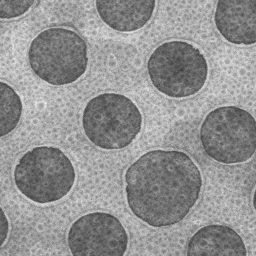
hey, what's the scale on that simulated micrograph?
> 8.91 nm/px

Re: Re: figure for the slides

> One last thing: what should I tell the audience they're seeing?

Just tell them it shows holes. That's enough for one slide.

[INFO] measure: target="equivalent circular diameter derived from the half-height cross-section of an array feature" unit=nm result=521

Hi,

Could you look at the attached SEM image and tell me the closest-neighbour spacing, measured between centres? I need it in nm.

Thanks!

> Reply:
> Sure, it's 748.